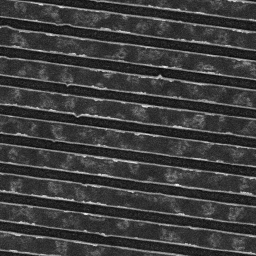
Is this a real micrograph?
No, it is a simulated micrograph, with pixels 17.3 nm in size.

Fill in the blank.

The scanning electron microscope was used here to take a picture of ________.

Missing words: parallel lines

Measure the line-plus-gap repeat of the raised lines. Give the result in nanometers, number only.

500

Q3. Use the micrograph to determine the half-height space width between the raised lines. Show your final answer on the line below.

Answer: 10.4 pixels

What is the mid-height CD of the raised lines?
317 nm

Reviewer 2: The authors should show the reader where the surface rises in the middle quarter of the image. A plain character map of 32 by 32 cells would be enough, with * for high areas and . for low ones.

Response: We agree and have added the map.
**.....................*********
*********.....................**
***************.................
*************************.......
********************************
.....***************************
...........*********************
....................************
*******.....................****
***************.................
**********************..........
******************************..
..******************************
.........*.*********************
.................***************
*****...................********
*************...................
*********************...........
****************************....
********************************
.........***********************
................****************
***.....................********
***********.....................
******************..............
**************************......
********************************
.....*.*************************
..............******************
*...................************
********....................****
**************..................